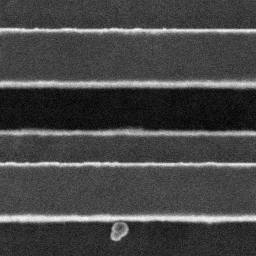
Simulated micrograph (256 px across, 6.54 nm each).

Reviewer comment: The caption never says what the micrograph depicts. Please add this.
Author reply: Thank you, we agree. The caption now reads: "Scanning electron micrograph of lines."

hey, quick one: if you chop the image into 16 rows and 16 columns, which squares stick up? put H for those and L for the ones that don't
HHHHHHHHHHHHHHHH
HHHHHHHHHHHHHHHH
HHHHHHHHHHHHHHHH
HHHHHHHHHHHHHHHH
HHHHHHHHHHHHHHHH
LLLLLLLLLLLLLLLL
LLLLLLLLLLLLLLLL
LLLLLLLLLLLLLLLL
HHHHHHHHHHHHHHHH
HHHHHHHHHHHHHHHH
HHHHHHHHHHHHHHHH
HHHHHHHHHHHHHHHH
HHHHHHHHHHHHHHHH
HHHHHHHHHHHHHHHH
LLLLLLLLLLLLLLLL
LLLLLLLLLLLLLLLL